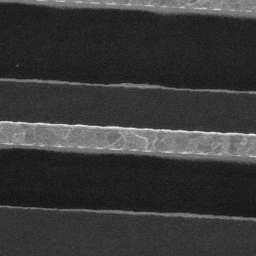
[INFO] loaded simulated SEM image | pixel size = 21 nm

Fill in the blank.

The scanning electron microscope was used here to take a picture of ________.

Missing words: lines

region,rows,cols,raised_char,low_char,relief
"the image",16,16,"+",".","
...........+++++
................
................
................
................
++++++++++......
++++++++++++++++
++++++++++++++++
++++++++++++++++
.........+++++++
................
................
................
++++++++++++....
++++++++++++++++
++++++++++++++++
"